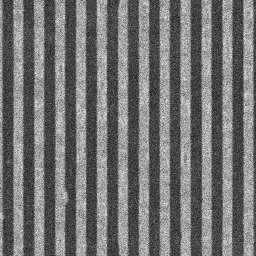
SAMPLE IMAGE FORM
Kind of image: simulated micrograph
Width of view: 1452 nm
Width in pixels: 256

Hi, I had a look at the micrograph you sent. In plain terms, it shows parallel lines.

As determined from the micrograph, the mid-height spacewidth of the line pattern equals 0.0652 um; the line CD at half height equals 0.0553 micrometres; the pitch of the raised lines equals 119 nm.